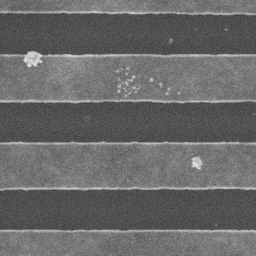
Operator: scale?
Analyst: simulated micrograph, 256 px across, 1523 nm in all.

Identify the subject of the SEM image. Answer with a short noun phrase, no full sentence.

lines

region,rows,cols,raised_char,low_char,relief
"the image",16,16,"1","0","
1111111111111111
0000000000000000
0000000000000000
1111111111111111
1111111111111111
1111111111111111
0000000000000000
0000000000000000
0000000000000000
1111111111111111
1111111111111111
1111111111111111
0000000000000000
0000000000000000
1111111111111111
1111111111111111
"